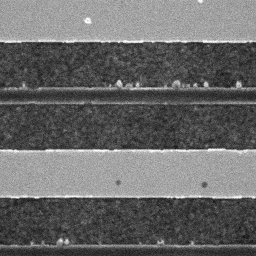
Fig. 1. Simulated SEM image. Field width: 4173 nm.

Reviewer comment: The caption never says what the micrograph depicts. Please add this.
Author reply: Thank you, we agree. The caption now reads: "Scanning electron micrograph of lines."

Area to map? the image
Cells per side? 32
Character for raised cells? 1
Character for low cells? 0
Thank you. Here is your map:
11111111111111111111111111111111
11111111111111111111111111111111
11111111111111111111111111111111
11111111111111111111111111111111
11111111111111111111111111111111
00000000000000000000000000000000
00000000000000000000000000000000
00000000000000000000000000000000
00000000000000000000000000000000
00000000000000000000000000000000
00000000000000000000000000000000
11111111111111111111111111111111
11111111111111111111111111111111
00000000000000000000000000000000
00000000000000000000000000000000
00000000000000000000000000000000
00000000000000000000000000000000
00000000000000000000000000000000
00000000000000000000000000000000
11111111111111111111111111111111
11111111111111111111111111111111
11111111111111111111111111111111
11111111111111111111111111111111
11111111111111111111111111111111
11111111111111111111111111111111
00000000000000000000000000000000
00000000000000000000000000000000
00000000000000000000000000000000
00000000000000000000000000000000
00000000000000000000000000000000
00000001100000000000100000000000
11111111111111111111111111111111